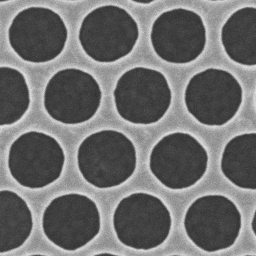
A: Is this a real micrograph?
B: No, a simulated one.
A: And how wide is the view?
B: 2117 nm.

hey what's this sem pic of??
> a regular array of holes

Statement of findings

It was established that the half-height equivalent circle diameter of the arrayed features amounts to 474 nanometres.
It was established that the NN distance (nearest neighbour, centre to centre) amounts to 0.583 microns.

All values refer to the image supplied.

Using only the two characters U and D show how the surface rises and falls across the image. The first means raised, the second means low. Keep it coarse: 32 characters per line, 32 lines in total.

UUUUUUUUUUUUUUUUUUUUUUUUUUUUUUUU
UUDDDDDUUUUDDDDDUUUUUDDDUUUUUDDD
UUDDDDDDUUDDDDDDDUUDDDDDDUUUDDDD
UDDDDDDDUUDDDDDDDUUDDDDDDDUUDDDD
UDDDDDDDUUDDDDDDDUUDDDDDDDUUDDDD
UDDDDDDDUUDDDDDDDUUDDDDDDDUUDDDD
UUDDDDDDUUUDDDDDUUUDDDDDDUUUDDDD
UUUDDDUUUUUUDDDUUUUUDDDDUUUUUDDD
DUUUUUUUUUUUUUUUUDUUUUUUUUUUUUUU
DDDUUUUDDDDUUUUDDDDDDUUUDDDDDUUU
DDDUUUDDDDDDUUUDDDDDDUUDDDDDDDUU
DDDDUUDDDDDDDUDDDDDDDUUDDDDDDDUU
DDDDUDDDDDDDDUDDDDDDDUUDDDDDDDUU
DDDDUUDDDDDDUUUDDDDDDUUDDDDDDDUU
DDDUUUDDDDDDUUUDDDDDUUUUDDDDDUUU
DDUUUUUUUUUUUUUUUDDUUUUUUDDDUUUU
UUUUDUUUUUUUDDDUUUUUUUUUUUUUUUUU
UUDDDDDUUUDDDDDDUUUUDDDDDUUUUDDD
UDDDDDDDUUDDDDDDDUUDDDDDDDUUDDDD
UDDDDDDDUUDDDDDDDUUDDDDDDDUUDDDD
UDDDDDDDUUDDDDDDDUUDDDDDDDUUDDDD
UDDDDDDDUUDDDDDDDUUDDDDDDDUUDDDD
UUDDDDDUUUUDDDDDUUUUDDDDDUUUUDDD
UUUUDUUUUUUUDDUUUUUUUDDUUUUUUUUD
DDUUUUUDDDDUUUUUDDDUUUUUUUDDUUUU
DDDUUUDDDDDDUUUDDDDDUUUUDDDDDUUU
DDDDUUDDDDDDUUDDDDDDDUUDDDDDDDUU
DDDDUDDDDDDDDUDDDDDDDUUDDDDDDDUU
DDDDUDDDDDDDUUDDDDDDDUUDDDDDDDUD
DDDDUUDDDDDDUUUDDDDDDUUUDDDDDDUU
DDDUUUUDDDDUUUUDDDDDUUUUDDDDDUUU
DUUUUUUUUUUUUUUUUUUUUUUUUUUUUUUU